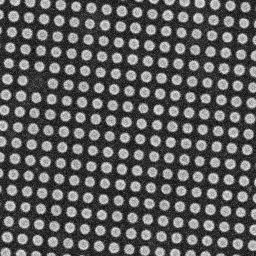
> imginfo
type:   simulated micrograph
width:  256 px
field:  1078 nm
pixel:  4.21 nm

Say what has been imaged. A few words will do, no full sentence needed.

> a regular array of raised bodies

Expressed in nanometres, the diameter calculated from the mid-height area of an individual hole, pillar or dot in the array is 39.7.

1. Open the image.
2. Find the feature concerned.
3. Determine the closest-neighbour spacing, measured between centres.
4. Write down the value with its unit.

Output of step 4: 64.2 nm